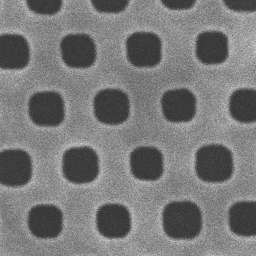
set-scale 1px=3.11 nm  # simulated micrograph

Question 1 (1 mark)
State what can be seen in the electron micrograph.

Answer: a regular array of holes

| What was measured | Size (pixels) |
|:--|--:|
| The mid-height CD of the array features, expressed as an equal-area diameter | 37.1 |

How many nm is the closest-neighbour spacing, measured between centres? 203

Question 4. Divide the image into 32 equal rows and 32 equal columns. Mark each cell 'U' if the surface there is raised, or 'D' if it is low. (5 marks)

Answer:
UUUDDDDDUUUUDDDDUUUUDDDDUUUUDDDD
UUUUDDDUUUUUDDDUUUUUUUUUUUUUUUDU
UUUUUUUUUUUUUUUUUUUUUUUUUUUUUUUU
UUUUUUUUUUUUUUUUUUUUUUUUUUUUUUUU
DDDUUUUUDDDUUUUUDDDDUUUUUDDDUUUU
DDDDUUUUDDDDUUUUDDDDUUUUDDDDDUUU
DDDDUUUUDDDDUUUUDDDDUUUUDDDDDUUU
DDDDUUUUDDDDUUUUDDDDUUUUUDDDUUUU
DDDUUUUUUUDUUUUUUUUUUUUUUUUUUUUU
UUUUUUUUUUUUUUUUUUUUUUUUUUUUUUUU
UUUUUUUUUUUUUUUUUUUUUUUUUUUUUUUU
UUUUUDDUUUUUDDDUUUUUUDDDUUUUUDDD
UUUUDDDDUUUUDDDDUUUUDDDDUUUUUDDD
UUUUDDDDUUUUDDDDUUUUDDDDUUUUUDDD
UUUUDDDDUUUUDDDDUUUUUDDDUUUUUDDD
UUUUDDDUUUUUUDDUUUUUUUUUUUUUUUUU
UUUUUUUUUUUUUUUUUUUUUUUUUUUUUUUU
UUUUUUUUUUUUUUUUUUUUUUUUUUUUUUUU
UUUUUUUUUDDUUUUUUDDUUUUUUDDDUUUU
DDDDUUUUDDDDUUUUDDDDUUUUDDDDDUUU
DDDDUUUUDDDDUUUUDDDDUUUUDDDDDUUU
DDDDUUUUDDDDUUUUDDDDUUUUDDDDDUUU
DDDDUUUUDDDDUUUUUUDDUUUUUDDDUUUU
UUUUUUUUUUUUUUUUUUUUUUUUUUUUUUUU
UUUUUUUUUUUUUUUUUUUUUUUUUUUUUUUU
UUUUUUUUUUUUUDDUUUUUUDDDUUUUUDDD
UUUUDDDDUUUUDDDDUUUUDDDDDUUUUDDD
UUUDDDDDUUUUDDDDUUUUDDDDDUUUUDDD
UUUUDDDDUUUUDDDDUUUUDDDDDUUUUDDD
UUUUDDDUUUUUUDDDUUUUUDDDDUUUUUDD
UUUUUUUUUUUUUUUUUUUUUUUUUUUUUUUU
UUUUUUUUUUUUUUUUUUUUUUUUUUUUUUUU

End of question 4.